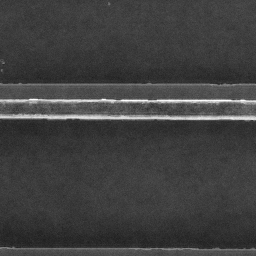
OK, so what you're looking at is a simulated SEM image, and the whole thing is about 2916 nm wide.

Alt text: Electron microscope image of lines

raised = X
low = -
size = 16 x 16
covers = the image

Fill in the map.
----------------
----------------
----------------
----------------
----------------
XXXXXXXXXXXXXXXX
XXXXXXXXXXXXXXXX
----------------
----------------
----------------
----------------
----------------
----------------
----------------
----------------
X---------------